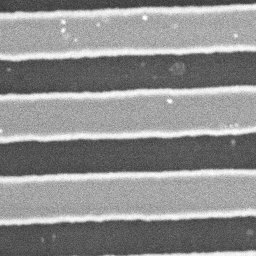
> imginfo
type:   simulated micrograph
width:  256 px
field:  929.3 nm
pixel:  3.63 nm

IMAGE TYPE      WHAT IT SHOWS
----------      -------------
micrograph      lines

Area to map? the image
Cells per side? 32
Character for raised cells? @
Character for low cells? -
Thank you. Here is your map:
--------------------------------
------@@@@@@@@@@@@@@@@@@@@@@@@@@
@@@@@@@@@@@@@@@@@@@@@@@@@@@@@@@@
@@@@@@@@@@@@@@@@@@@@@@@@@@@@@@@@
@@@@@@@@@@@@@@@@@@@@@@@@@@@@@@@@
@@@@@@@@@@@@@@@@@@@@@@@@@@@@@@@@
@@@@@@@@@@@@@@@@@@@@@@@@@@@-----
--------------------------------
--------------------------------
--------------------------------
--------------------------------
---------------@@@@@@@@@@@@@@@@@
@@@@@@@@@@@@@@@@@@@@@@@@@@@@@@@@
@@@@@@@@@@@@@@@@@@@@@@@@@@@@@@@@
@@@@@@@@@@@@@@@@@@@@@@@@@@@@@@@@
@@@@@@@@@@@@@@@@@@@@@@@@@@@@@@@@
@@@@@@@@@@@@@@@@@@@@@@@@@@@@@@@@
@@@@@@@@------------------------
--------------------------------
--------------------------------
--------------------------------
---------------------@@@@@@@@@@@
@@@@@@@@@@@@@@@@@@@@@@@@@@@@@@@@
@@@@@@@@@@@@@@@@@@@@@@@@@@@@@@@@
@@@@@@@@@@@@@@@@@@@@@@@@@@@@@@@@
@@@@@@@@@@@@@@@@@@@@@@@@@@@@@@@@
@@@@@@@@@@@@@@@@@@@@@@@@@@@@@@@@
@@@@@@@@@@@@@-------------------
--------------------------------
--------------------------------
--------------------------------
-------------------------------@